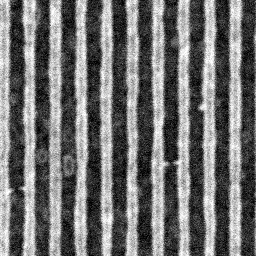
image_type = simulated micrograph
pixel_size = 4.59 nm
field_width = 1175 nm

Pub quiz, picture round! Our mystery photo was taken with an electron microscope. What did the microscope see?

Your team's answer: parallel lines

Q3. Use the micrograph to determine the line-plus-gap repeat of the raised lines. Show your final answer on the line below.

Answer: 0.118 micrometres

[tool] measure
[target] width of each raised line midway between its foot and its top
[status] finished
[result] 40.7 nm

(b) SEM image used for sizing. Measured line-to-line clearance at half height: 0.0774 µm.